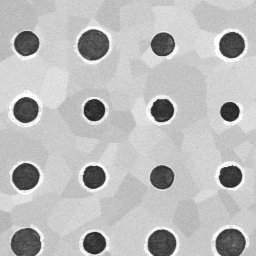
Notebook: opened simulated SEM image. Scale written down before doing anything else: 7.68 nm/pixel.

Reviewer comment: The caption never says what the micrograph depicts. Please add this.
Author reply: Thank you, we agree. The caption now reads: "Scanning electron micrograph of a regular array of holes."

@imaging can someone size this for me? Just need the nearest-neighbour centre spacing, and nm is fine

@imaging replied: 508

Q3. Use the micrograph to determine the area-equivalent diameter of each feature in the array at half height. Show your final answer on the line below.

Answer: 190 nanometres